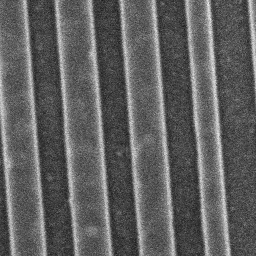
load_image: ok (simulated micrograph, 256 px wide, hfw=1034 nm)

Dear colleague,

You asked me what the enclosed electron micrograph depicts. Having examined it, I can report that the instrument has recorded one or a few lines or trenches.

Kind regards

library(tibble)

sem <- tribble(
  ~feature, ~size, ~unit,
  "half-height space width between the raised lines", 30.1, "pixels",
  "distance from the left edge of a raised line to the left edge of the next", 252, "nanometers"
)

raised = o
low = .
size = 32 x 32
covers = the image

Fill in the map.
ooo....oooo....oooo....ooo.....o
ooo....oooo....oooo....ooo.....o
ooo....ooooo...oooo....ooo.....o
ooo....ooooo...oooo.....oo......
ooo....ooooo...ooooo....oo......
oooo...ooooo...ooooo....oo......
oooo...ooooo....oooo....oo......
oooo....oooo....oooo....ooo.....
oooo....oooo....oooo....ooo.....
oooo....oooo....oooo....ooo.....
oooo....oooo....oooo....ooo.....
oooo....oooo....oooo....ooo.....
oooo....oooo....oooo....ooo.....
oooo....oooo....oooo....ooo.....
oooo....oooo....oooo....ooo.....
oooo....ooooo...oooo....ooo.....
oooo....ooooo...ooooo....oo.....
oooo....ooooo...ooooo....oo.....
.oooo...ooooo....oooo....oo.....
.oooo...ooooo....oooo....ooo....
.oooo....oooo....oooo....ooo....
.oooo....oooo....oooo....ooo....
.oooo....oooo....oooo....ooo....
.oooo....oooo....oooo....ooo....
.oooo....oooo....oooo....ooo....
.oooo....oooo....oooo....ooo....
.oooo....oooo....oooo....ooo....
.oooo....ooooo...oooo....ooo....
.oooo....ooooo...oooo.....oo....
.oooo....ooooo...ooooo....oo....
.ooooo...ooooo...ooooo....ooo...
..oooo...ooooo....oooo....ooo...